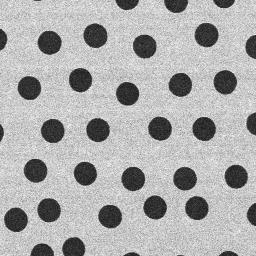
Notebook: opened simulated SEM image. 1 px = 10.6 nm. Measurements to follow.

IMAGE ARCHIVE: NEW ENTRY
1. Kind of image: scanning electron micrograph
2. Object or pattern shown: a regular array of holes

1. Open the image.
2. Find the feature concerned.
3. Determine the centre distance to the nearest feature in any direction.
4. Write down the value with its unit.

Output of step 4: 0.473 um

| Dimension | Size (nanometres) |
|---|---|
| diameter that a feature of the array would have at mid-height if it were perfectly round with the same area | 251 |